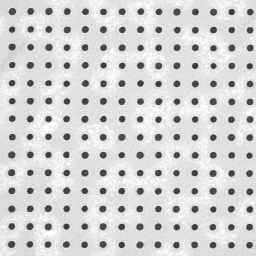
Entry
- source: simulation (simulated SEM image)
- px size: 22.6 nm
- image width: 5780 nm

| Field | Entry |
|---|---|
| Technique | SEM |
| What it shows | a regular array of holes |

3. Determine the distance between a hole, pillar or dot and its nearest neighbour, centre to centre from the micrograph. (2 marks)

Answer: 0.401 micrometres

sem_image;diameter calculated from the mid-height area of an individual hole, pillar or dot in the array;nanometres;159